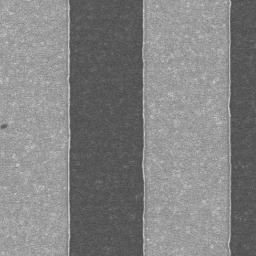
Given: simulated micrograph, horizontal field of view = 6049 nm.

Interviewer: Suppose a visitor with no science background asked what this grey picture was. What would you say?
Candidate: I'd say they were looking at one or a few lines or trenches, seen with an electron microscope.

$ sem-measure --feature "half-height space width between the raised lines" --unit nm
2030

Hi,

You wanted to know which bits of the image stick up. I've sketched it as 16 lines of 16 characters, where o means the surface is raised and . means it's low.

....ooooo.....oo
....ooooo.....oo
....ooooo.....oo
....ooooo.....oo
....ooooo.....oo
....ooooo.....oo
....ooooo.....oo
....ooooo.....oo
....ooooo.....oo
....ooooo.....oo
....ooooo.....oo
....ooooo.....oo
....ooooo.....oo
....ooooo.....oo
....ooooo.....oo
....ooooo.....oo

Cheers